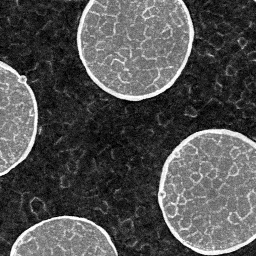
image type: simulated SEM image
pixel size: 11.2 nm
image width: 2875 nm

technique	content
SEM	raised bodies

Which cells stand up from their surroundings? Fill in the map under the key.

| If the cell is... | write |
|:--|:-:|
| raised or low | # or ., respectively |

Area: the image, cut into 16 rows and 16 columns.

.....#######....
.....#######....
.....#######....
.....#######....
#.....#####.....
##.....###......
##..............
##..............
##..........###.
##.........#####
#.........######
..........######
..........######
..........######
..####.....#####
.######.....###.